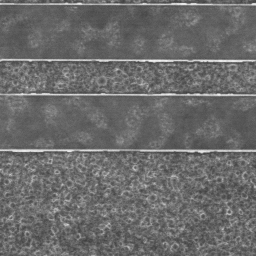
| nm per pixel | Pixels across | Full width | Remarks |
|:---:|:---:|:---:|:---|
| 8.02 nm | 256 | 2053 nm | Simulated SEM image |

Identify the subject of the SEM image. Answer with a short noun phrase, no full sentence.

one or a few lines or trenches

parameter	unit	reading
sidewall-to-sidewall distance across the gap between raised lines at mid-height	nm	438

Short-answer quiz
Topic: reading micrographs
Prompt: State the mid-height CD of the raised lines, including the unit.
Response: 281 nanometers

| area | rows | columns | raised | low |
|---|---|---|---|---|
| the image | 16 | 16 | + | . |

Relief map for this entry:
................
................
................
................
++++++++++++++++
++++++++++++++++
................
................
................
++++++++++++++++
++++++++++++++++
++++++++++++++++
++++++++++++++++
++++++++++++++++
++++++++++++++++
++++++++++++++++